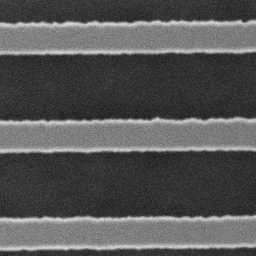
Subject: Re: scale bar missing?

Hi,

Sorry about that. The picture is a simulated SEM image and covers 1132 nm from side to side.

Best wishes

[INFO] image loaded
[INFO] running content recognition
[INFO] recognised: lines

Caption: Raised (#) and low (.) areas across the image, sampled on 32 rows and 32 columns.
................................
................................
................................
################################
################################
################################
#####################.#########.
................................
................................
................................
................................
................................
................................
................................
................................
################################
################################
################################
################################
................................
................................
................................
................................
................................
................................
................................
................................
################################
################################
################################
################################
................................